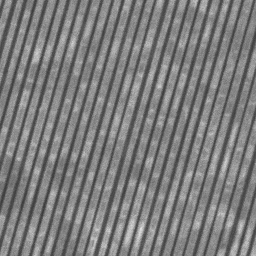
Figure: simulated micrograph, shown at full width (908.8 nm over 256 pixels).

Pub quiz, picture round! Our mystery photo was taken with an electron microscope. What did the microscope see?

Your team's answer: parallel lines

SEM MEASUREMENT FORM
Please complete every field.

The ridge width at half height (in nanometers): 24.8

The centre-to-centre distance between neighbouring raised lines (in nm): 37.2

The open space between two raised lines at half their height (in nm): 12.8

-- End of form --